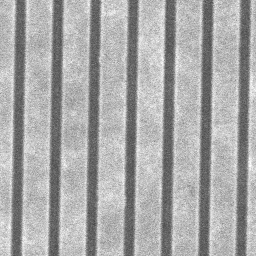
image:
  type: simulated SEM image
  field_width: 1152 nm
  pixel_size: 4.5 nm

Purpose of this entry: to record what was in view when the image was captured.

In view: parallel lines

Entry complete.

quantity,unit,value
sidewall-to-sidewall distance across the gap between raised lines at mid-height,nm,44.5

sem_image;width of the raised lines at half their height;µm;0.122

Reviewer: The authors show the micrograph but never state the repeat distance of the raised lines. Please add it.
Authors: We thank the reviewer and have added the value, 169 nm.